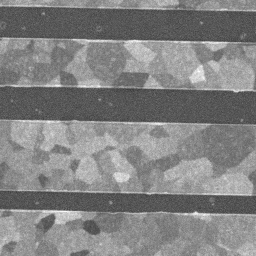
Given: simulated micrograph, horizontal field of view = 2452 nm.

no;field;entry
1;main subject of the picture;one or a few lines or trenches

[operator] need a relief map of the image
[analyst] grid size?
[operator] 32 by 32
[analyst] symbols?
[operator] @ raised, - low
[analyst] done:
@@@@@@@@@@@@@@@@@@@@@@@@@@@@@@@@
--------------------------------
--------------------------------
--------------------------------
--------------------------------
@@@@@@@@@@@@@@@@@@@@@@@@@@@@@@@@
@@@@@@@@@@@@@@@@@@@@@@@@@@@@@@@@
@@@@@@@@@@@@@@@@@@@@@@@@@@@@@@@@
@@@@@@@@@@@@@@@@@@@@@@@@@@@@@@@@
@@@@@@@@@@@@@@@@@@@@@@@@@@@@@@@@
@@@@@@@@@@@@@@@@@@@@@@@@@@@@@@@@
--------------------------------
--------------------------------
--------------------------------
--------------------------------
@@@@@@@@@@@@@@@@@@@@@@@@@-------
@@@@@@@@@@@@@@@@@@@@@@@@@@@@@@@@
@@@@@@@@@@@@@@@@@@@@@@@@@@@@@@@@
@@@@@@@@@@@@@@@@@@@@@@@@@@@@@@@@
@@@@@@@@@@@@@@@@@@@@@@@@@@@@@@@@
@@@@@@@@@@@@@@@@@@@@@@@@@@@@@@@@
@@@@@@@@@@@@@@@@@@@@@@@@@@@@@@@@
@@@@@@@@@@@@@@@@@@@@@@@@@@@@@@@@
@@@@@@@@@@@@@@@@@@@@@@@@@@@@@@@@
--------------------------------
--------------------------------
@@@@@@@@@@@---------------------
@@@@@@@@@@@@@@@@@@@@@@@@@@@@@@@@
@@@@@@@@@@@@@@@@@@@@@@@@@@@@@@@@
@@@@@@@@@@@@@@@@@@@@@@@@@@@@@@@@
@@@@@@@@@@@@@@@@@@@@@@@@@@@@@@@@
@@@@@@@@@@@@@@@@@@@@@@@@@@@@@@@@